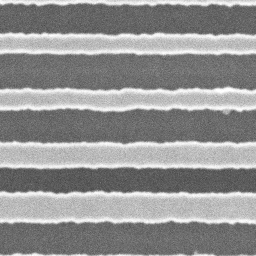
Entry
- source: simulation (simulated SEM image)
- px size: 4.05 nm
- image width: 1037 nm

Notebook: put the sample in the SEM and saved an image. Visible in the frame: lines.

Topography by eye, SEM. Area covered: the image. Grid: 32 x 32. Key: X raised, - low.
---XXX-X-----XXXXXXX---XXX-XXXXX
--------------------------------
--------------------------------
--------------------------------
XXXXXXXXXXXXXX-XXXXXXXXXXXXXXXXX
XXXXXXXXXXXXXXXXXXXXXXXXXXXXXXXX
XXXXXXXXXXXXXXXXXXXXXXXXXXXXXXXX
--------------------------------
--------------------------------
--------------------------------
--------------------------------
XXXXXXXXXXXXXXXXXXXXXXXXXXXXXXXX
XXXXXXXXXXXXXXXXXXXXXXXXXXXXXXXX
XXXXXXX---XXXXXXX-XXXXXXXXXXXXXX
--------------------------------
--------------------------------
--------------------------------
--------------------------------
XXXXXXXXXXXXXXXXXXXXXXXXXXXXXXXX
XXXXXXXXXXXXXXXXXXXXXXXXXXXXXXXX
XXXXXXXXXXXXXXXXXXXXXXXXXXXXXXXX
--------------------------------
--------------------------------
--------------------------------
XXXXXXXXXXXXXXXXXXXXXXXXXXXXXXXX
XXXXXXXXXXXXXXXXXXXXXXXXXXXXXXXX
XXXXXXXXXXXXXXXXXXXXXXXXXXXXXXXX
XXXXXXXXXXXXXXXXXXXXXXXXXXXXXXXX
--------------------------------
--------------------------------
--------------------------------
--------------------------------